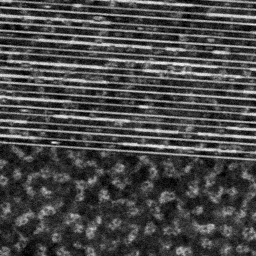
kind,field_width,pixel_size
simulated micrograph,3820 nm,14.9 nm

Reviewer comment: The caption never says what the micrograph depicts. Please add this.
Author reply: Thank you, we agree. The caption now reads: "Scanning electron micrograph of parallel lines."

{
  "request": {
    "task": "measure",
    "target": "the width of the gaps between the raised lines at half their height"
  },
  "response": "89.3 nanometers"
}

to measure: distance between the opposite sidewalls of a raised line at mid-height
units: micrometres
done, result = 0.0204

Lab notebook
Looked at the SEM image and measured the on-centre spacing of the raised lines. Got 111 nanometres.